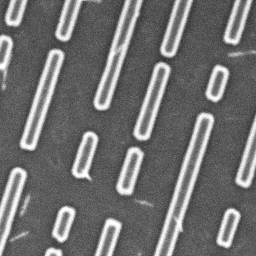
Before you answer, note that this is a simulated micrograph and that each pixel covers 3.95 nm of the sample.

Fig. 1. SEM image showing parallel lines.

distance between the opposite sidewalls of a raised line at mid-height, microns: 0.0456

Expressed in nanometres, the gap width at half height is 174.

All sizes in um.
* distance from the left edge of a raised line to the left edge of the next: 0.211